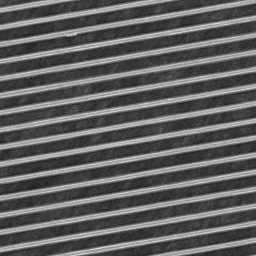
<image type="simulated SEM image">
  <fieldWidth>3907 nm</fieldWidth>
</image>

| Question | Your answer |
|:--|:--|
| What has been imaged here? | parallel lines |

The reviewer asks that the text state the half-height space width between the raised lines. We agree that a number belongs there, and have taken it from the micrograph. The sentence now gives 0.18 microns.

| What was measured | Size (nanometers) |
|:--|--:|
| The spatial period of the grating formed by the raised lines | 257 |